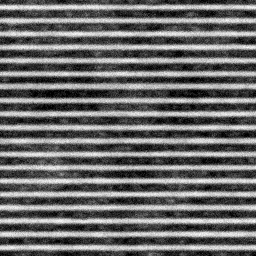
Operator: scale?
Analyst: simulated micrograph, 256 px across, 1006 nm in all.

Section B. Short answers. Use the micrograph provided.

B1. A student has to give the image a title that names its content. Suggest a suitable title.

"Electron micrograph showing parallel lines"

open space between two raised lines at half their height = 33.9 nm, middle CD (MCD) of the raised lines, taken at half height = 16.7 nanometres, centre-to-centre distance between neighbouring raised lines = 52.3 nanometres